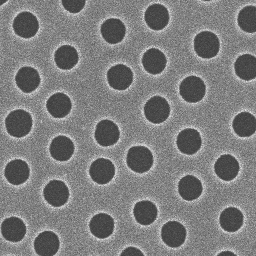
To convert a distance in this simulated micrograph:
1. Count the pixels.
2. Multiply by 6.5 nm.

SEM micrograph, a regular array of holes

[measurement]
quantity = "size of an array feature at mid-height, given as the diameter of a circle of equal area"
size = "165 nm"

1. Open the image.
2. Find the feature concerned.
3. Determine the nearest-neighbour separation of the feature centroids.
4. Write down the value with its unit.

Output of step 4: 277 nanometres